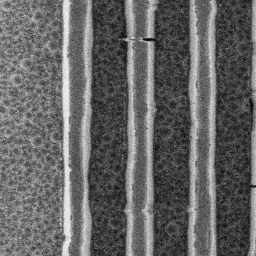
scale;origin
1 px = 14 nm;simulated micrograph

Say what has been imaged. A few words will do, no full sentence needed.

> one or a few lines or trenches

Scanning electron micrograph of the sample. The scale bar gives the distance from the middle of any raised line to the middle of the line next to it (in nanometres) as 882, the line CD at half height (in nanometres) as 291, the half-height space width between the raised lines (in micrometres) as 0.595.